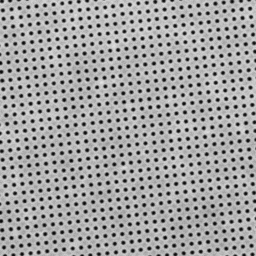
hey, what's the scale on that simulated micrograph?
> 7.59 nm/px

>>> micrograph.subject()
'a regular array of holes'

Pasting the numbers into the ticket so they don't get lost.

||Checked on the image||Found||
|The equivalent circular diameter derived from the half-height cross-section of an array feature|35.3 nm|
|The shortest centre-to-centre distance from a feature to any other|63.1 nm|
